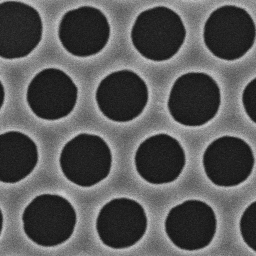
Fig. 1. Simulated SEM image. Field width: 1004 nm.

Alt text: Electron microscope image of a regular array of holes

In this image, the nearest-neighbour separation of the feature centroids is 0.275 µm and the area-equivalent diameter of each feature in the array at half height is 200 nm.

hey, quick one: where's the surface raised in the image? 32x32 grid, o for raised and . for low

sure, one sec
...ooooooooooooooooooooooooooooo
.....ooo.....ooooo....ooooo....o
.....ooo.....oooo......ooo......
.....oo.......ooo......ooo......
.....oo.......oo.......oo.......
.....ooo.....oooo......ooo......
....ooooo...ooooo.....oooo.....o
ooooooooooooooooooo..ooooooo.ooo
oooooo.ooooooooooooooooooooooooo
oooo.....oooo....oooooo...oooooo
oooo.....ooo......oooo.....oooo.
.oo.......oo.......oo......ooo..
ooo.......oo......ooo.......oo..
oooo.....ooo......ooo......oooo.
ooooo...ooooo....oooo......oooo.
ooooooooooooooooooooooo...oooooo
o.oooooooooooooooooooooooooooooo
....ooooo....ooooo....ooooo...oo
.....ooo......ooo......ooo.....o
.....oo.......ooo......oo.......
.....oo.......ooo......oo.......
....oooo......ooo......ooo.....o
...oooooo....ooooo....oooo.....o
oooooooooooooooooooooooooooooooo
ooooo...oooooooooooooooooooooooo
oooo.....oooo....ooooo....ooooo.
ooo......ooo......ooo......ooo..
ooo.......oo......ooo......ooo..
ooo......ooo......ooo......ooo..
ooo......ooo......ooo......ooo..
ooooo...ooooo....ooooo....ooooo.
oooooooooooooooooooooooooooooooo